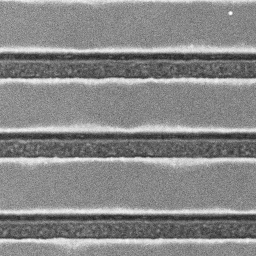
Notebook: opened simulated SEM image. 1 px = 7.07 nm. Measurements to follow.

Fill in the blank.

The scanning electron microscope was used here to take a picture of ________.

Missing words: lines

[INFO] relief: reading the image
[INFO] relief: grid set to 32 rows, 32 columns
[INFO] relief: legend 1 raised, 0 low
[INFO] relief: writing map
11111111111111111111111111111111
11111111111111111111111111111111
11111111111111111111111111111111
11111111111111111111111111111111
11111111111111111111111111111111
11111111111111111111111111111111
00000000000000000000000000000000
00000000000000000000000000000000
00000000000000000000000000000000
00000000000000000000000000000000
11111111111111111111111111111111
11111111111111111111111111111111
11111111111111111111111111111111
11111111111111111111111111111111
11111111111111111111111111111111
11111111111111111111111111111111
01000000000000011000000000011000
00000000000000000000000000000000
00000000000000000000000000000000
00000000000000000000000000000000
11111111111111111111111111111111
11111111111111111111111111111111
11111111111111111111111111111111
11111111111111111111111111111111
11111111111111111111111111111111
11111111111111111111111111111111
11111111111111111111111111111111
00000000000000000000000000000000
00000000000000000000000000000000
00000000000000000000000000000000
11111111111111111111111111111111
11111111111111111111111111111111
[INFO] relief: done